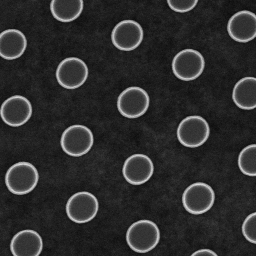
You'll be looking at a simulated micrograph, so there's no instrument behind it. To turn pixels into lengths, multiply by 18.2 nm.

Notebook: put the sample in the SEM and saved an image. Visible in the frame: a regular array of raised bodies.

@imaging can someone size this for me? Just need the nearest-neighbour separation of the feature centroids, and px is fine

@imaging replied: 66.9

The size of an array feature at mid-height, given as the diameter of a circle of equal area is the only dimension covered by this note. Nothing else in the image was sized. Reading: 0.549 µm